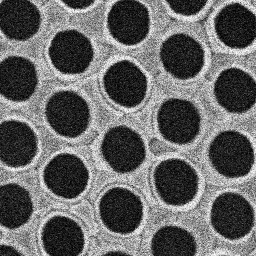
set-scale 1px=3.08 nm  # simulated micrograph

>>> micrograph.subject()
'a regular array of holes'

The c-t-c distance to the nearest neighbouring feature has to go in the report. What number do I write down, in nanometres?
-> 190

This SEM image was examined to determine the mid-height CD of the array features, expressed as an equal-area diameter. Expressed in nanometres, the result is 137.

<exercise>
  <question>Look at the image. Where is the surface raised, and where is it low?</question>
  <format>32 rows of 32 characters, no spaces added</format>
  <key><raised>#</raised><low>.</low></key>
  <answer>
....####...###....###.....###.##
.....#########.....###...##....#
.....########......########.....
.....#########.....########.....
#...###....###....###...###.....
######.....####..###.....###...#
######......########.....#######
#...##.....#########.....#######
....###....###...####....#######
.....########.....####..###....#
.....########.....#########.....
....####.####.....#########.....
#..###....####....###..####.....
######.....#########....####...#
######.....#########.....#######
...###.....#########.....#######
....###...###....###.....###..##
.....########.....###...###....#
.....########.....########......
....###..####.....########......
#..###.....###...###...####.....
######.....####.###.....###....#
######.....########......#######
...###.....###.#####.....#######
....###...###....###....###...##
....########......###..####....#
....########......########......
....##...####.....########......
#.####....####...###...####....#
#####.....#########.....####..##
#####......########.....########
..####....####.####.....########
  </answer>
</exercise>